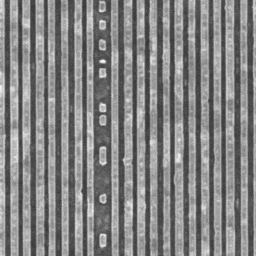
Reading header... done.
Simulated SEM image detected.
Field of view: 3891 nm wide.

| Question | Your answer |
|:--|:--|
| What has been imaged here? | parallel lines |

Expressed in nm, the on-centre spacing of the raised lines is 194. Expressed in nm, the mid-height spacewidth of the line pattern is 101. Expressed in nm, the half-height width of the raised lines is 101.